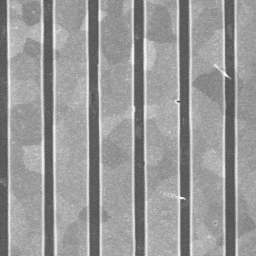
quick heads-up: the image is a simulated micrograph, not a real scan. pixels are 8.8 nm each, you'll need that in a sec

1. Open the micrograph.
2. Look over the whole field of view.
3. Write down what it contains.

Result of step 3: parallel lines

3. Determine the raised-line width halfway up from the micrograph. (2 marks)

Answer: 0.297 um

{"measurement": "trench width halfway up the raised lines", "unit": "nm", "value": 102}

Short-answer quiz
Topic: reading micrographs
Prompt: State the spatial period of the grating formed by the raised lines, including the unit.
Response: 400 nanometres